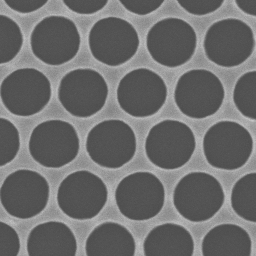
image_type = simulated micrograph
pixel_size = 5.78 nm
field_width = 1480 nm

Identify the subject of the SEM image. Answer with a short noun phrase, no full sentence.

a regular array of holes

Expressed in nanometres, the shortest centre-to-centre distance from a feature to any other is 332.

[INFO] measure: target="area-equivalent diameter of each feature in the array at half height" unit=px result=49.2